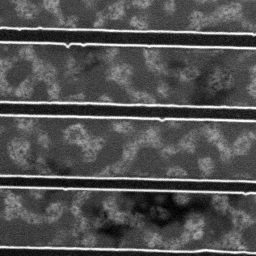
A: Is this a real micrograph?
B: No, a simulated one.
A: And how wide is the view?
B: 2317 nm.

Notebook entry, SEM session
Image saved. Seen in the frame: one or a few lines or trenches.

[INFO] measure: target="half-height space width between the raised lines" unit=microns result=0.538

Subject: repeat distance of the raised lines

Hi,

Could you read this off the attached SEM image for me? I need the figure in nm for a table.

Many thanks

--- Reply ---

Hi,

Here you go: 661